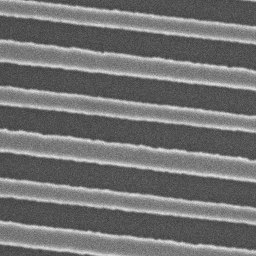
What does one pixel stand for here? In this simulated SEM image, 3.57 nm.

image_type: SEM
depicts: lines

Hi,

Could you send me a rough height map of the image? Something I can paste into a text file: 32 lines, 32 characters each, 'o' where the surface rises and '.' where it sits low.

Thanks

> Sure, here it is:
ooooooo.........................
ooooooooooooooo.................
......ooooooooooooooooooo.......
...............ooooooooooooooooo
.......................ooooooooo
ooooo...........................
oooooooooooo....................
oooooooooooooooooooooo..........
.......ooooooooooooooooooooooo..
.................ooooooooooooooo
.........................ooooooo
ooooooo.........................
ooooooooooooooo.................
....oooooooooooooooooooo........
.............oooooooooooooooooo.
.......................ooooooooo
ooo............................o
ooooooooooo.....................
ooooooooooooooooooo.............
....oooooooooooooooooooooooo....
..............oooooooooooooooooo
.....................ooooooooooo
oo.............................o
ooooooooooo.....................
oooooooooooooooooooo............
........ooooooooooooooooooo.....
..................oooooooooooooo
...........................ooooo
ooooooo.........................
ooooooooooooooo.................
oooooooooooooooooooooooo........
........oooooooooooooooooooooooo